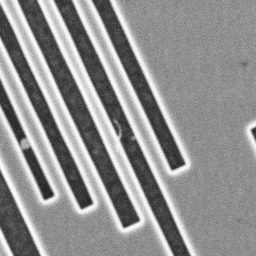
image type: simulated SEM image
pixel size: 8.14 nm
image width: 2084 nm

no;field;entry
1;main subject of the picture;groups of lines, slits or small figures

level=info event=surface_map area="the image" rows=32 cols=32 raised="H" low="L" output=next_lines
HHLLLHHLLHHHLLHHHHHHHHHHHHHHHHHH
LHHLLLHLLLHHLLLHHHHHHHHHHHHHHHHH
LHHLLLHHLLHHHLLHHHHHHHHHHHHHHHHH
LLHHLLHHLLLHHLLLHHHHHHHHHHHHHHHH
LLHHLLLHHLLHHLLLHHHHHHHHHHHHHHHH
LLLHHLLHHLLLHHLLHHHHHHHHHHHHHHHH
HLLHHLLLHHLLHHLLLHHHHHHHHHHHHHHH
HLLLHLLLHHLLLHHLLHHHHHHHHHHHHHHH
HHLLHHLLLHLLLHHLLLHHHHHHHHHHHHHH
HHLLHHLLLHHLLLHHLLHHHHHHHHHHHHHH
HHHLLHHLLLHLLLHHLLLHHHHHHHHHHHHH
LHHLLHHLLLHHLLLHHLLHHHHHHHHHHHHH
LHHHLLHHLLLHLLLHHLLLHHHHHHHHHHHH
LLHHLLHHLLLHHLLHHHLLHHHHHHHHHHHH
LLHHLLLHHLLLHLLLHHLLLHHHHHHHHHHH
HLLHHLLHHLLLHHLLHHHLLHHHHHHHHHHH
HLLHHLLLHHLLLHLLLHHLLLHHHHHHHHHL
HHLLHHLLHHLLLHHLLHHHLLHHHHHHHHHH
HHLLHHLLLHHLLHHLLLHHLLHHHHHHHHHH
HHHLLHHLLHHLLLHHLLHHLLLHHHHHHHHH
HHHLLHHLLLHHLLHHLLLHHLLHHHHHHHHH
HHHHLLHHLLHHLLLHHLLHHHHHHHHHHHHH
LHHHLLHHLLLHLLLHHLLLHHHHHHHHHHHH
LHHHHLLHHLLHHLLLHHLLHHHHHHHHHHHH
LLHHHLLHHLLHHLLLHHLLLHHHHHHHHHHH
LLHHHHHHHHLLHHLLLHLLLHHHHHHHHHHH
LLLHHHHHHHHHHHLLLHHLLLHHHHHHHHHH
LLLHHHHHHHHHHHHLLLHLLLHHHHHHHHHH
LLLLHHHHHHHHHHHHHHHHLLHHHHHHHHHH
LLLLHHHHHHHHHHHHHHHHLLLHHHHHHHHH
HLLLLHHHHHHHHHHHHHHHHLLHHHHHHHHH
HLLLLHHHHHHHHHHHHHHHHLLLHHHHHHHH